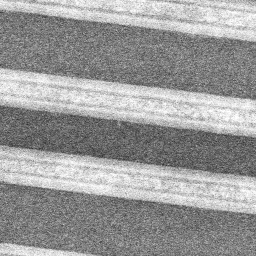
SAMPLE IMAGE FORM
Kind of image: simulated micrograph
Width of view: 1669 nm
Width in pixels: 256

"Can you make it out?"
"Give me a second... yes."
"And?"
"one or a few lines or trenches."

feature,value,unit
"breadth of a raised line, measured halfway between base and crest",180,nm